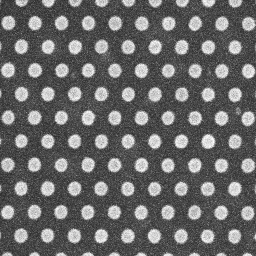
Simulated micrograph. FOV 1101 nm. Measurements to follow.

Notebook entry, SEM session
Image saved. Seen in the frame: a regular array of raised bodies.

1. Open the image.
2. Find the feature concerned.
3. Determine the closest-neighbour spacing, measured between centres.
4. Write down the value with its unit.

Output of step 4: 114 nm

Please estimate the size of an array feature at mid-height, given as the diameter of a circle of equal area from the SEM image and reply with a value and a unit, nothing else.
0.054 um